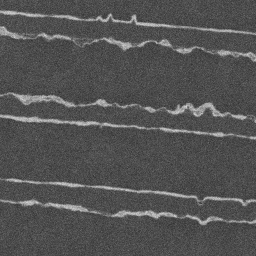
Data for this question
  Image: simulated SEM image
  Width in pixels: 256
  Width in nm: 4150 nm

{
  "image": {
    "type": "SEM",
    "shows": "one or a few lines or trenches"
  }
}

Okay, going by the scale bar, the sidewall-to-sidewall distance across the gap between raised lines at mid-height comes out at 999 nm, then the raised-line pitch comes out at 1360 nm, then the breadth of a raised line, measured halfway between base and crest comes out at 0.363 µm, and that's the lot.